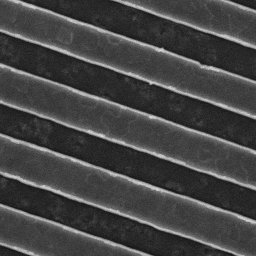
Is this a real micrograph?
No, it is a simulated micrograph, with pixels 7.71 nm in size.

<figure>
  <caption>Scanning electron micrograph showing one or a few lines or trenches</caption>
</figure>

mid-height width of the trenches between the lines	236	nm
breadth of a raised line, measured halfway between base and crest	278	nanometers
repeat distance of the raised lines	514	nanometers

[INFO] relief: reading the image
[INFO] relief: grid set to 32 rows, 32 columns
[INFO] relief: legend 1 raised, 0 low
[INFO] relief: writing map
11100000000000001111111111111100
11111100000000000001111111111111
11111111100000000000011111111111
11111111111100000000000011111111
00111111111111100000000000011111
00000111111111111100000000000011
00000000111111111111100000000000
00000000000111111111111100000000
10000000000000111111111111100000
11110000000000000111111111111100
11111110000000000001111111111111
11111111110000000000001111111111
11111111111110000000000001111111
00111111111111110000000000001111
00000111111111111110000000000001
00000000111111111111110000000000
00000000000111111111111110000000
11000000000000111111111111110000
11111000000000000111111111111110
11111111000000000000111111111111
11111111111000000000000111111111
11111111111111000000000000111111
00111111111111111000000000001111
00000111111111111111000000000001
00000000111111111111111000000000
00000000000111111111111111000000
11100000000000111111111111111000
11111100000000000111111111111110
11111111100000000000111111111111
11111111111100000000000111111111
11111111111111100000000000111111
00011111111111111000000000000111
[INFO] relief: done